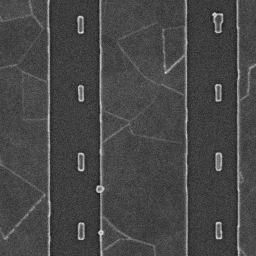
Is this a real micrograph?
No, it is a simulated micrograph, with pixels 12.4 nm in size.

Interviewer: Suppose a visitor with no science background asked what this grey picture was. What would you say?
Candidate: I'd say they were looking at wiring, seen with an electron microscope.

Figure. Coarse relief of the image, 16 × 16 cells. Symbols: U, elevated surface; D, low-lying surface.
UUUDDDUUUUUUDDDU
UUUDDDUUUUUUDDDU
UUUDDDUUUUUUDDDU
UUUDDDUUUUUUDDDU
UUUDDDUUUUUUDDDU
UUUDDDUUUUUUDDDU
UUUDDDUUUUUUDDDU
UUUDDDUUUUUUDDDU
UUUDDDUUUUUUDDDU
UUUDDDUUUUUUDDDU
UUUDDDUUUUUUDDDU
UUUDDDUUUUUUDDDU
UUUDDDUUUUUUDDDU
UUUDDDUUUUUUDDDU
UUUDDDUUUUUUDDDU
UUUDDDUUUUUUDDDU